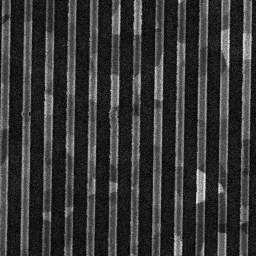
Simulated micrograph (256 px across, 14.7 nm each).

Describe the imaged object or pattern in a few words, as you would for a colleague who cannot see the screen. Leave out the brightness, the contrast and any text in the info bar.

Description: parallel lines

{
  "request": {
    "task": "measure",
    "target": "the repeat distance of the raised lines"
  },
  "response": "0.322 microns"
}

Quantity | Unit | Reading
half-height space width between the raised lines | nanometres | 215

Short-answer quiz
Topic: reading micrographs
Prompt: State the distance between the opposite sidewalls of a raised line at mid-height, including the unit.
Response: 7.37 px